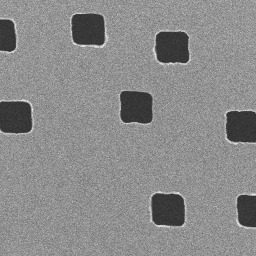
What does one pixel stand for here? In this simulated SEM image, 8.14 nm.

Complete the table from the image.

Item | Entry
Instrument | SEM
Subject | holes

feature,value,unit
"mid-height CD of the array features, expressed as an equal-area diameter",288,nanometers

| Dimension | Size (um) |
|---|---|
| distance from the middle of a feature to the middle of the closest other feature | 0.634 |